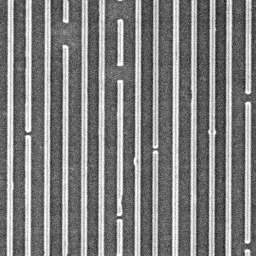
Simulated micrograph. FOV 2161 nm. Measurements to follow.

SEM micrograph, parallel lines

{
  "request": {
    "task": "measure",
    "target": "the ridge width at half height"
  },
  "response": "39 nm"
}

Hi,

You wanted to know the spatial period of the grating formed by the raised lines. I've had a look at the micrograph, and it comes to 0.154 um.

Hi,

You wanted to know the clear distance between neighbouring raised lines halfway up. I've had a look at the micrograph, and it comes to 0.117 um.